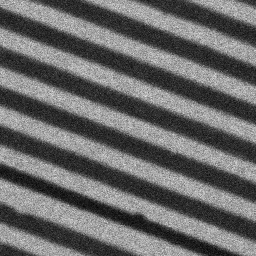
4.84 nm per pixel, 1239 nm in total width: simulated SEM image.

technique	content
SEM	parallel lines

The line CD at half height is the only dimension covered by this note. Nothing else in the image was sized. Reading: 95.6 nm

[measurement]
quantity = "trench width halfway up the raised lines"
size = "82.5 nanometers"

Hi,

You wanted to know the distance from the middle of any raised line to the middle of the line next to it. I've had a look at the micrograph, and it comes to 0.176 um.